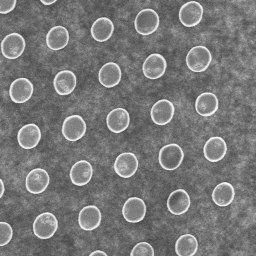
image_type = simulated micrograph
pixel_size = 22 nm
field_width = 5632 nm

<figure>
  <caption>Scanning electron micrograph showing a regular array of raised bodies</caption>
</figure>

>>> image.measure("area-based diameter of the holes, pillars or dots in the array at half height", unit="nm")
522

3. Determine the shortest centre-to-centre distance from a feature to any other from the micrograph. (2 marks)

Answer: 990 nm